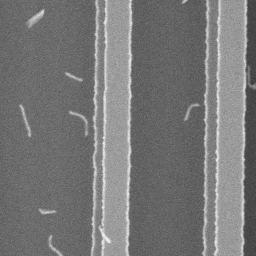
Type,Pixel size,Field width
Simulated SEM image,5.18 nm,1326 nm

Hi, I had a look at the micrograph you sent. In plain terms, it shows lines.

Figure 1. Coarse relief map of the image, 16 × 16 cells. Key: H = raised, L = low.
LLLLLLHHLLLLLHHL
LLLLLLHHLLLLLHHL
LLLLLLHHLLLLLHHL
LLLLLLHHLLLLLHHL
LLLLLLHHLLLLLHHL
LLLLLLHHLLLLLHHL
LLLLLLHHLLLLLHHL
LLLLLLHHLLLLLHHL
LLLLLLHHLLLLLHHL
LLLLLLHHLLLLLHHL
LLLLLLHHLLLLLHHL
LLLLLLHHLLLLLHHL
LLLLLLHHLLLLLHHL
LLLLLLHHLLLLLHHL
LLLLLLHHLLLLLHHL
LLLLLLHHLLLLLHHL